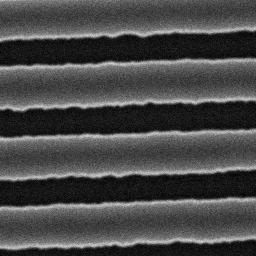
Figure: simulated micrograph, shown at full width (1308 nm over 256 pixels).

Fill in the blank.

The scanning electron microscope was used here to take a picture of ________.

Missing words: lines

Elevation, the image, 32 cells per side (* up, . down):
********************************
********************************
********************************
********************************
************.*..................
................................
................................
......................****.*****
********************************
********************************
********************************
********************************
********************************
********..*.....................
................................
................................
.....................*...*******
********************************
********************************
********************************
********************************
***************************.....
.*..............................
................................
................................
............********************
********************************
********************************
********************************
********************************
*****************...............
................................